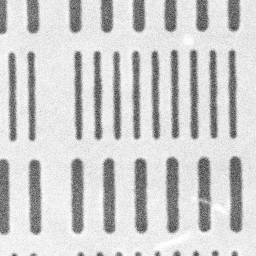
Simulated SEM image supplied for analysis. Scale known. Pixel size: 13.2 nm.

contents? groups of lines, slits or small figures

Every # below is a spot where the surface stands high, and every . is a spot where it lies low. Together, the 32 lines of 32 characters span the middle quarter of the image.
##...##..###..###..###..##...##.
##...##..###..###..###..###..##.
##...##..###..###..###..###..##.
##...##..###..###..###..###..##.
##...##...##..###..###..###..##.
##...##...##..###..###..###..##.
##...##...##..###..###..###..##.
##...##...##..###..###..###..##.
##...##...##..###..###..##...##.
##...##...##..###..###..##...##.
##...##...##..###..###..###..##.
##...##..###..###..###..###..##.
##...##..###..###..###..###..##.
##...##..###..###..###..###..##.
##...##...##..###..###..###..##.
###..##...##..###..###..###..##.
###..##...##..###..###..###..##.
###..##...##..###..###..###..##.
###.####.####.###..###..###..###
################################
################################
################################
################################
###.######..######..######..####
##...#####...#####...####....###
##...####....####....####....###
##...#####...####....####....###
##...####....####....####....###
##...####....####....####....###
#....####....####....####....###
#....####....####....####....###
##...####....####....####....###